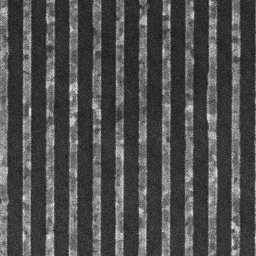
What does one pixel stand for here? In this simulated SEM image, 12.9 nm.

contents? parallel lines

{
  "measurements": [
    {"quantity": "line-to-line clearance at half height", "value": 216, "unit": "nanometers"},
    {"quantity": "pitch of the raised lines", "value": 299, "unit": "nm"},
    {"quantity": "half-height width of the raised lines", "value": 88.5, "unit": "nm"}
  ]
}